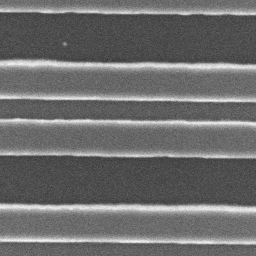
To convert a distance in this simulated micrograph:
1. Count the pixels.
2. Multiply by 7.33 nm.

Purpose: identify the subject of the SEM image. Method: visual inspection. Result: lines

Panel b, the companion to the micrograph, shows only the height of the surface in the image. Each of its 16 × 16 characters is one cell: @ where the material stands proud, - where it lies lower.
@@@@@@@@@@@@@@@@
----------------
----------------
----------------
@@@@@@@@@@@@@@@@
@@@@@@@@@@@@@@@@
@@@@@@@@@@@@@@@@
@@@@@@@@@@@@@@@@
@@@@@@@@@@@@@@@@
@@@@@@@@@@@@@@@@
----------------
----------------
----------------
@@@@@@@@@@@@@@@@
@@@@@@@@@@@@@@@@
@@@@@@@@@@@@@@@@